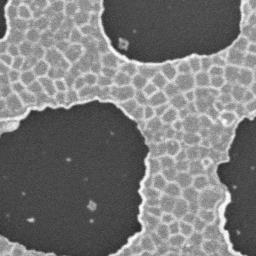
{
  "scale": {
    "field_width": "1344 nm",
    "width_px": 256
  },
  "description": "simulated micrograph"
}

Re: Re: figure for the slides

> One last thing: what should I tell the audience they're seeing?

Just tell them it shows holes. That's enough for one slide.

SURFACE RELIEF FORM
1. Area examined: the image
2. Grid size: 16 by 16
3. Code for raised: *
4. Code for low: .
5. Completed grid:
******.........*
******.........*
*******........*
********....****
****************
****************
*****..*********
*.......*******.
.........******.
.........*****..
.........*****..
.........*****..
.........*****..
.........*****..
.........*****..
**......*******.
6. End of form